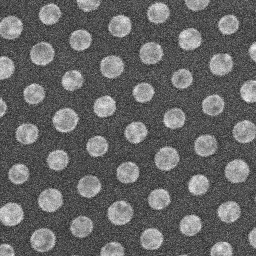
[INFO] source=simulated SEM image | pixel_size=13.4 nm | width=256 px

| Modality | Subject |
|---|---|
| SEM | a regular array of raised bodies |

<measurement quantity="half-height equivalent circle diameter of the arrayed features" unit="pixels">20.5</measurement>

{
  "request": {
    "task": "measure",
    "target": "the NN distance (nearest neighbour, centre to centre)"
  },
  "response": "0.543 µm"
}